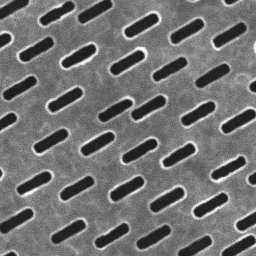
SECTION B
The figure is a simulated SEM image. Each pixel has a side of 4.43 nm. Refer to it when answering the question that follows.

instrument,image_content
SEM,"a regular array of holes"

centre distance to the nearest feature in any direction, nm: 181